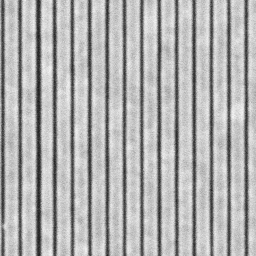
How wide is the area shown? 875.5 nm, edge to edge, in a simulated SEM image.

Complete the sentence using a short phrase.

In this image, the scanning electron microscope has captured parallel lines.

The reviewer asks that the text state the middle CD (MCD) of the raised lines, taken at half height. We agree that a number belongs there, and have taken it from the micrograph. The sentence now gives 44 nanometers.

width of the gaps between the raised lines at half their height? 17.1 nm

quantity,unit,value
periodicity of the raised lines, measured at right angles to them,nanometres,59.4